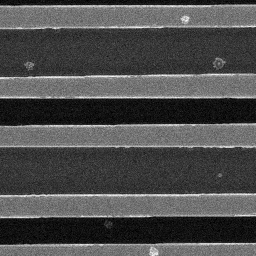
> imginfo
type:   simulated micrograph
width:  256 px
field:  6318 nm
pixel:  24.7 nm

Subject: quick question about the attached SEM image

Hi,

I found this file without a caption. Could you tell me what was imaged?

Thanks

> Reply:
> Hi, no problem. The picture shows lines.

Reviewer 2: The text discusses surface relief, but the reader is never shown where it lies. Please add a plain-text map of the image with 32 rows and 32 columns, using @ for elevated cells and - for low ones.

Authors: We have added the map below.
--------------------------------
@@@@@@@@@@@@@@@@@@@@@@@@@@@@@@@@
@@@@@@@@@@@@@@@@@@@@@@@@@@@@@@@@
@@@@@@@@------------------------
--------------------------------
--------------------------------
--------------------------------
--------------------------------
--------------------------------
------------------@@@@@@@@@@@@@@
@@@@@@@@@@@@@@@@@@@@@@@@@@@@@@@@
@@@@@@@@@@@@@@@@@@@@@@@@@@@@@@@@
--------------------------------
--------------------------------
--------------------------------
----------------------------@@@@
@@@@@@@@@@@@@@@@@@@@@@@@@@@@@@@@
@@@@@@@@@@@@@@@@@@@@@@@@@@@@@@@@
--------------------------------
--------------------------------
--------------------------------
--------------------------------
--------------------------------
--------------------------------
@@@@@@@@@@@@@@@@@@@@@@@@@@@@@@@@
@@@@@@@@@@@@@@@@@@@@@@@@@@@@@@@@
@@@@@@@@@@@@@@@@@@@@@@@@@@@@@@@@
--------------------------------
--------------------------------
--------------------------------
-------------------@@@@@@@@@@@@@
@@@@@@@@@@@@@@@@@@@@@@@@@@@@@@@@